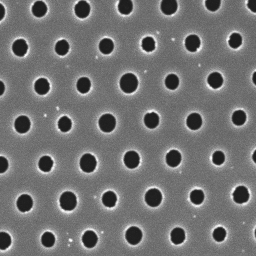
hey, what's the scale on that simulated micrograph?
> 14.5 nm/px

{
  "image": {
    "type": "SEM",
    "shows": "a regular array of holes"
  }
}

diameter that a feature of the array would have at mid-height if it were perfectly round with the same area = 235 nm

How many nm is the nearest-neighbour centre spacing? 612